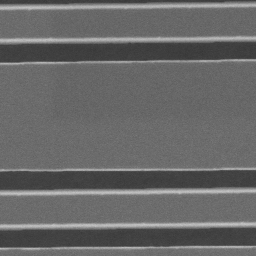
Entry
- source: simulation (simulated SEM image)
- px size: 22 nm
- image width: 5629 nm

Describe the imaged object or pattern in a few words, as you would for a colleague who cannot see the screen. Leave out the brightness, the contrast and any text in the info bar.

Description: lines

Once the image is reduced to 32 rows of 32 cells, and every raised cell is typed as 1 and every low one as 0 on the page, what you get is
00000000000000000000111111111111
11111111111111111111111111111111
11111111111111111111111111111111
11111111111111111111111111111111
11111111111111111111111111111111
00000000000000000000000000000000
00000000000000000000000000000000
00000000000000000000000000011111
11111111111111111111111111111111
11111111111111111111111111111111
11111111111111111111111111111111
11111111111111111111111111111111
11111111111111111111111111111111
11111111111111111111111111111111
11111111111111111111111111111111
11111111111111111111111111111111
11111111111111111111111111111111
11111111111111111111111111111111
11111111111111111111111111111111
11111111111111111111111111111111
11111111111111111111111111111111
00000000000000000000000000000000
00000000000000000000000000000000
00000000000000000000000000000000
11111111111111111111111111111111
11111111111111111111111111111111
11111111111111111111111111111111
11111111111111111111111111111111
11111111100000000000000000000000
00000000000000000000000000000000
00000000000000000000000000000000
11111111111111111111111111111111